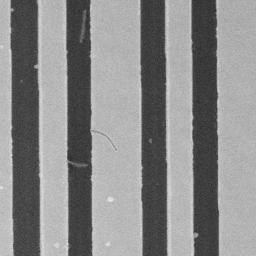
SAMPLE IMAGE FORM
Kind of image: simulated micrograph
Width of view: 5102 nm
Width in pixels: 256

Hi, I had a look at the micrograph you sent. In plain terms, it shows lines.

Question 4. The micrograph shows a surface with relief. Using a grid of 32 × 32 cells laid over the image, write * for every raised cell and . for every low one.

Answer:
*....***...******....***...*****
*....***...******....***...*****
*....***...******....***...*****
*....***...******....***...*****
*....***...******....***...*****
*....***...******....***...*****
*....***...******....***...*****
*....***...******....***...*****
*....***...*******...***...*****
*....***...*******...***...*****
*....***...*******...***...*****
*....***...*******...***...*****
*....***...*******...***...*****
*....***...*******...***...*****
*....***...*******...***...*****
*....***...*******...***...*****
*....***...*******...***...*****
*....***....******...***...*****
*....***....******...***...*****
*....***...*******...***...*****
*....***...*******...***...*****
*....***....******...***...*****
*....***...*******...***...*****
*....***....******...***...*****
*....***....******...***...*****
*....***....******...***...*****
*....***....******...***...*****
**...***....******...***...*****
**...***....******...***...*****
**...***....******...***...*****
**...***....******...***...*****
**...***....******...***...*****